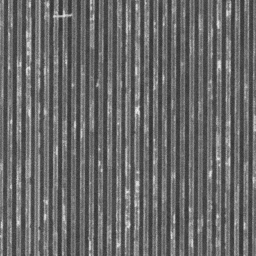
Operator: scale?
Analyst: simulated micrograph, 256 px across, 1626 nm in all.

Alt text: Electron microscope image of parallel lines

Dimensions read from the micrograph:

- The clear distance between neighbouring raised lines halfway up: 0.0286 micrometres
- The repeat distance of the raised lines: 57.7 nanometres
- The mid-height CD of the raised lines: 28.6 nm